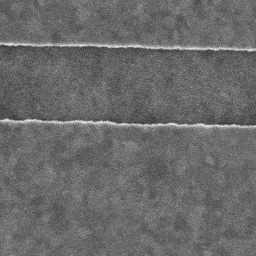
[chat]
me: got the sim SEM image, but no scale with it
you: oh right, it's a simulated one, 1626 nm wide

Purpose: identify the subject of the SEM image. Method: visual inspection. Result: one or a few lines or trenches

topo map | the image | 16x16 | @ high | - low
@@@@@@@@@@@@@@@@
@@@@@@@@@@@@@@@@
@@@@@@@@@@@@@@@@
----------------
----------------
----------------
----------------
----------------
@@@@@@@@@@@@@@@@
@@@@@@@@@@@@@@@@
@@@@@@@@@@@@@@@@
@@@@@@@@@@@@@@@@
@@@@@@@@@@@@@@@@
@@@@@@@@@@@@@@@@
@@@@@@@@@@@@@@@@
@@@@@@@@@@@@@@@@